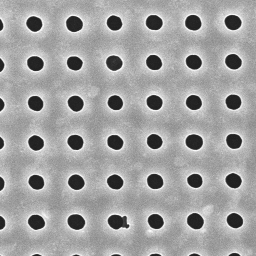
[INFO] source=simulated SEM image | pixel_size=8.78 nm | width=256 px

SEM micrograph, a regular array of holes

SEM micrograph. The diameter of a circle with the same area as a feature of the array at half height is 140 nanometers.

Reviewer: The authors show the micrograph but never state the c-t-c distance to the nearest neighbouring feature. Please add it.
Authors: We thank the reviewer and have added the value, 39.1 pixels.